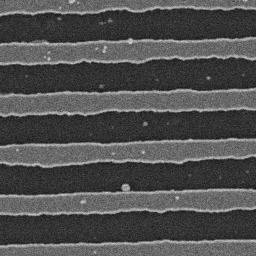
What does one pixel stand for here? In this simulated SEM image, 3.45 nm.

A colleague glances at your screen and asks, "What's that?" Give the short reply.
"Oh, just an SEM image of lines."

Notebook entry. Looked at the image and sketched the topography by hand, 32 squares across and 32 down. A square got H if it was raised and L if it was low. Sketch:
HHHHHHHHHHHHHHHHHHHHHHHHHHHHHHHH
HHHHHHLHHHHHLLLLLLLLLLLLLLLLLLLL
LLLLLLLLLLLLLLLLLLLLLLLLLLLLLLLL
LLLLLLLLLLLLLLLLLLLLLLLLLLLLLLLL
LLLLLLLLLLLLLLLLLLLLLLLLLLLLLLLL
HHHHHHHHHHHHHHHHHHHHHHHHHHHHHHHH
HHHHHHHHHHHHHHHHHHHHHHHHHHHHHHHH
HHHHHHHHHHHHHHHHHHHLLLLLLLLLLLLL
LLLLLLLLLLLLLLLLLLLLLLLLLLLLLLLL
LLLLLLLLLLLLLLLLLLLLLLLLLLLLLLLL
LLLLLLLLLLLLLLLLLLLLLLLLLLLLLLLL
LLLLLLLLLLLLLLLHLHHHLHHHHHHHHHHH
HHHHHHHHHHHHHHHHHHHHHHHHHHHHHHHH
HHHHHHHHHHHHHHHHHHHHHHHHHHHHHHHH
LLLLLLLLLLLLLLLLLLLLLLLLLLLLLLLL
LLLLLLLLLLLLLLLLLLLLLLLLLLLLLLLL
LLLLLLLLLLLLLLLLLLLLLLLLLLLLLLLL
LLLLLLLLLLLLLLLLLLLLLLLLLLLLHHHH
HHHHHHHHHHHHHHHHHHHHHHHHHHHHHHHH
HHHHHHHHHHHHHHHHHHHHHHHHHHHHHHHH
LHHHHHHHHHHLLLLLLLLLLLLLLLLLLLLL
LLLLLLLLLLLLLLLLLLLLLLLLLLLLLLLL
LLLLLLLLLLLLLLLLLLLLLLLLLLLLLLLL
LLLLLLLLLLLLLLLLLLLLLLLLLLLLLLLL
HHLLLHHHHHHHHHHHHHHHHHHHHHHHHHHH
HHHHHHHHHHHHHHHHHHHHHHHHHHHHHHHH
HHHHHHHHHHHHHHHLLLLLLLLLLLLLLLLL
LLLLLLLLLLLLLLLLLLLLLLLLLLLLLLLL
LLLLLLLLLLLLLLLLLLLLLLLLLLLLLLLL
LLLLLLLLLLLLLLLLLLLLLLLLLLLLLLLL
LLLLLLLLHHHHHHHHHHHHHHHHHHHHHHHH
HHHHHHHHHHHHHHHHHHHHHHHHHHHHHHHH